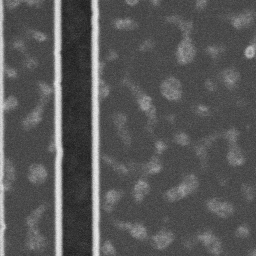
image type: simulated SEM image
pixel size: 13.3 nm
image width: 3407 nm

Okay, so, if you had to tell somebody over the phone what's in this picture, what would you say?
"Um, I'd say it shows one or a few lines or trenches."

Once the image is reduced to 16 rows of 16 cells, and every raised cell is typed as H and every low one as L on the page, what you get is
HHHHLLHHHHHHHHHH
HHHHLLHHHHHHHHHH
HHHHLLHHHHHHHHHH
HHHHLLHHHHHHHHHH
HHHHLLHHHHHHHHHH
HHHHLLHHHHHHHHHH
HHHHLLHHHHHHHHHH
HHHHLLHHHHHHHHHH
HHHHLLHHHHHHHHHH
HHHHLLHHHHHHHHHH
HHHHLLHHHHHHHHHH
HHHHLLHHHHHHHHHH
HHHHLLHHHHHHHHHH
HHHHLLHHHHHHHHHH
HHHHLLHHHHHHHHHH
HHHHLLHHHHHHHHHH